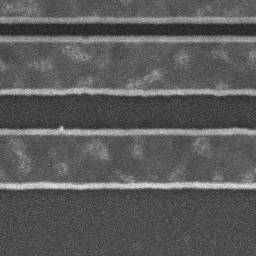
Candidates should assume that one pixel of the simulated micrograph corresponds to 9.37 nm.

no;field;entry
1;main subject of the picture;one or a few lines or trenches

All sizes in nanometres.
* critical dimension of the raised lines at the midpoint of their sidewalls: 498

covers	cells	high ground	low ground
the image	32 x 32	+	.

++++++++++++++++++++++++++++++++
++++++++++++++++++++++++++++++++
........+..........+............
................................
................................
++++++++++++++++++++++++++++++++
++++++++++++++++++++++++++++++++
++++++++++++++++++++++++++++++++
++++++++++++++++++++++++++++++++
++++++++++++++++++++++++++++++++
++++++++++++++++++++++++++++++++
.................++........++...
................................
................................
................................
................................
.......+.....................++.
++++++++++++++++++++++++++++++++
++++++++++++++++++++++++++++++++
++++++++++++++++++++++++++++++++
++++++++++++++++++++++++++++++++
++++++++++++++++++++++++++++++++
++++++++++++++++++++++++++++++++
................................
................................
................................
................................
................................
................................
................................
................................
................................